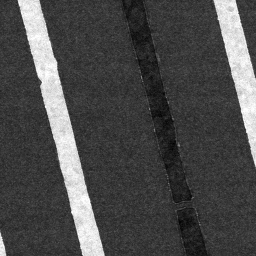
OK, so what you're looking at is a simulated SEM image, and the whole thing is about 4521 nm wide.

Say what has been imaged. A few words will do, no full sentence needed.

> one or a few lines or trenches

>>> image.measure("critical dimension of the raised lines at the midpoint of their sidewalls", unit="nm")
351